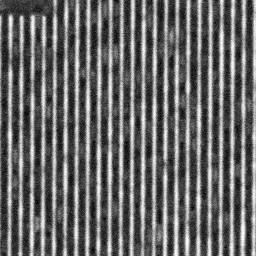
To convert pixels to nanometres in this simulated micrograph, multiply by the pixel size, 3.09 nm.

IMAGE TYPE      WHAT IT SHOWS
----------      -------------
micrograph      parallel lines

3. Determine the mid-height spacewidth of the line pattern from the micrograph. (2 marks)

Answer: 27.8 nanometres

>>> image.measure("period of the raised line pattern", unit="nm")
34.3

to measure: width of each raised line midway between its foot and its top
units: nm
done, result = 8.1